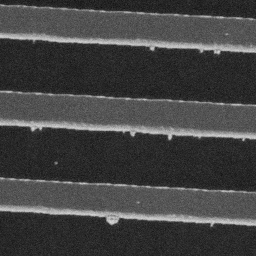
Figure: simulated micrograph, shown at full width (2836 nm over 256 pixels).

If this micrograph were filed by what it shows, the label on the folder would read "lines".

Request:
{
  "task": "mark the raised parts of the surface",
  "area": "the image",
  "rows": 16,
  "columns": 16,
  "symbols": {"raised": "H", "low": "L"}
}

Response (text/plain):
HHHHLLLLLLLLLLLL
HHHHHHHHHHHHHHHH
LLLHHHHHHHHHHHHH
LLLLLLLLLLLLLLLL
LLLLLLLLLLLLLLLL
LLLLLLLLLLLLLLLL
HHHHHHHHHHHHHHLL
HHHHHHHHHHHHHHHH
LLLLLLLLLLLLLLHH
LLLLLLLLLLLLLLLL
LLLLLLLLLLLLLLLL
HHHHHHLLLLLLLLLL
HHHHHHHHHHHHHHHH
LLLLLLHHHHHHHHHH
LLLLLLLLLLLLLLLL
LLLLLLLLLLLLLLLL